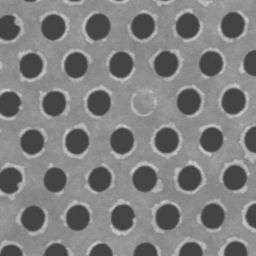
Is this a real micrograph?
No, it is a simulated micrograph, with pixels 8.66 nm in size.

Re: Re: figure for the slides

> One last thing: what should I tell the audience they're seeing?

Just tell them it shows a regular array of holes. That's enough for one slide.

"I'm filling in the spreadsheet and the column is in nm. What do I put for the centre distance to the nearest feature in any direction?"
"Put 382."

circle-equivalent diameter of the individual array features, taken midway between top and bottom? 213 nanometers